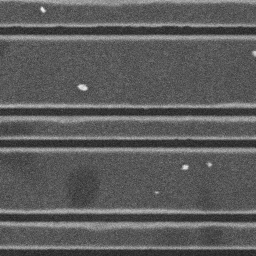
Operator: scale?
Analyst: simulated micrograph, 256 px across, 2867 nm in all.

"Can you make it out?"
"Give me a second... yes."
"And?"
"lines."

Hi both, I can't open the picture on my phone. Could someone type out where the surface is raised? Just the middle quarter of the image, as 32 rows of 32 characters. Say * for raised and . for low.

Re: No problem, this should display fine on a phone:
********************************
********************************
********************************
********************************
********************************
********************************
********************************
********************************
********************************
********************************
********************************
................................
................................
....****************************
********************************
********************************
********************************
********************************
********************************
................................
................................
********************************
********************************
********************************
********************************
********************************
********************************
********************************
********************************
********************************
********************************
********************************